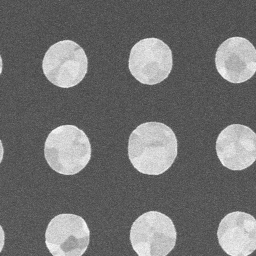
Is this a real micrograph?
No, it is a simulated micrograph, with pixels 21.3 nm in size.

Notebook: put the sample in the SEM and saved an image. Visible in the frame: raised bodies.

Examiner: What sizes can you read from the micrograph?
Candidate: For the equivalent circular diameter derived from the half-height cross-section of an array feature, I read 991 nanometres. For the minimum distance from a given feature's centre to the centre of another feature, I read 1820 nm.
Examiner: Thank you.